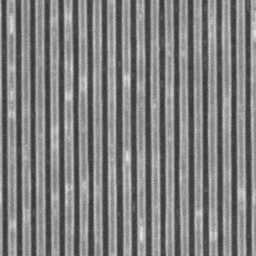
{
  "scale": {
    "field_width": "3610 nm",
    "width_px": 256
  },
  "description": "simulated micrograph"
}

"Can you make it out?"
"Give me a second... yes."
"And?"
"parallel lines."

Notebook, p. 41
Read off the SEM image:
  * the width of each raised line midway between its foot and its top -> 111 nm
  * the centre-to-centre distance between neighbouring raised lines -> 202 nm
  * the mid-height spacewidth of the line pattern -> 0.0969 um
